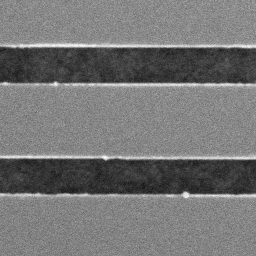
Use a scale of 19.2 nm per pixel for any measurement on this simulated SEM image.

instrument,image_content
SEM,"lines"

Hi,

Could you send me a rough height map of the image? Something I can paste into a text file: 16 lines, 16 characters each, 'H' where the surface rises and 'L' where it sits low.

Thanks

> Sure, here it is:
HHHHHHHHHHHHHHHH
HHHHHHHHHHHHHHHH
HHHHHHHHHHHHHHHH
LLLLLLLLLLLLLLLL
LLLLLLLLLLLLLLLL
HHHHHHHHHHHHHHHH
HHHHHHHHHHHHHHHH
HHHHHHHHHHHHHHHH
HHHHHHHHHHHHHHHH
HHHHHHHHHHHHHHHH
LLLLLLLLLLLLLLLL
LLLLLLLLLLLLLLLL
HHHHHHHHHHHHHHHH
HHHHHHHHHHHHHHHH
HHHHHHHHHHHHHHHH
HHHHHHHHHHHHHHHH